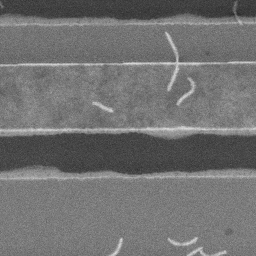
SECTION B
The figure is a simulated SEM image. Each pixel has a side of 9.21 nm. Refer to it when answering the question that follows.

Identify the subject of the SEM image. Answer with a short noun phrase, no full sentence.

lines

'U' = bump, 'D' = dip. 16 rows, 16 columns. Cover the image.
DDDDDDDDDDDDDDDD
DUUDDUUUUUUUUUUU
UUUUUUUUUUUUUUUU
UUUUUUUUUUUUUUUU
UUUUUUUUUUUUUUUU
UUUUUUUUUUUUUUUU
UUUUUUUUUUUUUUUU
UUUUUUUUUUUUUUUU
DDDDDDDDDDDDDDDD
DDDDDDDDDDDDDDDD
DDDDDDDDDDDDDDDD
UUUUUUUUUUUUUUUU
UUUUUUUUUUUUUUUU
UUUUUUUUUUUUUUUU
UUUUUUUUUUUUUUUU
UUUUUUUUUUUUUUUU